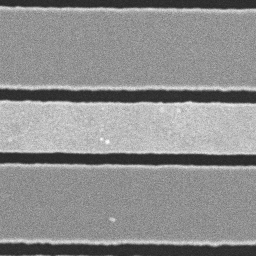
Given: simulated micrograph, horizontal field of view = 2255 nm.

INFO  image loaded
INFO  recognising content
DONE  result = lines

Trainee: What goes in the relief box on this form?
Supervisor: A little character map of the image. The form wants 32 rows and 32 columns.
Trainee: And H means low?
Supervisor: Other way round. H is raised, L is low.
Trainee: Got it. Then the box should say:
LLLLLLLLLLLLLLLLLLLLLLLLLLLLLLLL
HHHHHHHHHHHHHHHHHHHHHHHHHHHHHHHH
HHHHHHHHHHHHHHHHHHHHHHHHHHHHHHHH
HHHHHHHHHHHHHHHHHHHHHHHHHHHHHHHH
HHHHHHHHHHHHHHHHHHHHHHHHHHHHHHHH
HHHHHHHHHHHHHHHHHHHHHHHHHHHHHHHH
HHHHHHHHHHHHHHHHHHHHHHHHHHHHHHHH
HHHHHHHHHHHHHHHHHHHHHHHHHHHHHHHH
HHHHHHHHHHHHHHHHHHHHHHHHHHHHHHHH
HHHHHHHHHHHHHHHHHHHHHHHHHHHHHHHH
HHHHHHHHHHHHHHHHHHHHHHHHHHHHHHHH
LLLLLLLLLLLLLLLLLLLLLLLLLLLLLLLL
LLLLLLLLLLLLLLLLLLLLLLLLLLLLLLLL
HHHHHHHHHHHHHHHHHHHHHHHHHHHHHHHH
HHHHHHHHHHHHHHHHHHHHHHHHHHHHHHHH
HHHHHHHHHHHHHHHHHHHHHHHHHHHHHHHH
HHHHHHHHHHHHHHHHHHHHHHHHHHHHHHHH
HHHHHHHHHHHHHHHHHHHHHHHHHHHHHHHH
HHHHHHHHHHHHHHHHHHHHHHHHHHHHHHHH
LLLLLLLLLLLLLLLLLLLLLLLLLLLLLLLL
HHHLHHLLLLLLLLLLLLLLLLLLLLLLLLLL
HHHHHHHHHHHHHHHHHHHHHHHHHHHHHHHH
HHHHHHHHHHHHHHHHHHHHHHHHHHHHHHHH
HHHHHHHHHHHHHHHHHHHHHHHHHHHHHHHH
HHHHHHHHHHHHHHHHHHHHHHHHHHHHHHHH
HHHHHHHHHHHHHHHHHHHHHHHHHHHHHHHH
HHHHHHHHHHHHHHHHHHHHHHHHHHHHHHHH
HHHHHHHHHHHHHHHHHHHHHHHHHHHHHHHH
HHHHHHHHHHHHHHHHHHHHHHHHHHHHHHHH
HHHHHHHHHHHHHHHHHHHHHHHHHHHHHHHH
LLLHLLHHHHHHHHHHHHHHHHHHHHHHHHHH
LLLLLLLLLLLLLLLLLLLLLLLLLLLLLLLL